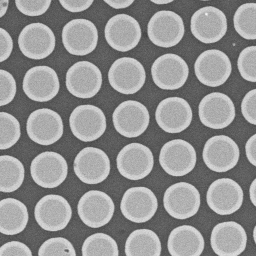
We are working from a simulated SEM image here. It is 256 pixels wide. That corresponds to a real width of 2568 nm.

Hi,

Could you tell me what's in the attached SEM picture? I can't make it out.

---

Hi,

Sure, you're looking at an array of small figures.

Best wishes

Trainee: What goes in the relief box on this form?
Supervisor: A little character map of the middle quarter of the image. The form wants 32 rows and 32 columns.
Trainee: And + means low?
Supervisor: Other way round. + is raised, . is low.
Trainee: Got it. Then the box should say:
..++++++....++++++++..+++++++++.
.++++++++..+++++++++..+++++++++.
.++++++++..+++++++++..+++++++++.
.++++++++..+++++++++..+++++++++.
.++++++++..+++++++++...+++++++..
.++++++++...++++++++...++++++...
.++++++++....++++++.............
..++++++.......+................
....+.....................+++...
...............+++......+++++++.
....++++......++++++...++++++++.
..+++++++....++++++++..+++++++++
..++++++++..+++++++++..+++++++++
..++++++++..+++++++++..+++++++++
.+++++++++..+++++++++..+++++++++
..++++++++...++++++++...+++++++.
..++++++++...+++++++.....+++++..
..++++++++....+++++.............
...+++++........................
..........................+++++.
...............+++++.....+++++++
.....++++.....+++++++...++++++++
...+++++++....++++++++..++++++++
...++++++++..+++++++++..++++++++
+..++++++++..+++++++++..++++++++
+.+++++++++..+++++++++..++++++++
+..++++++++...++++++++...+++++++
+..++++++++...+++++++.....++++..
....++++++......++++............
.....++++.......................
...........................+++++
................+++++.....++++++